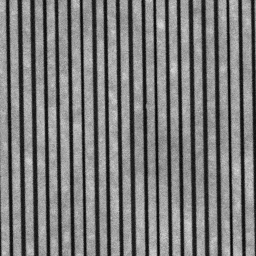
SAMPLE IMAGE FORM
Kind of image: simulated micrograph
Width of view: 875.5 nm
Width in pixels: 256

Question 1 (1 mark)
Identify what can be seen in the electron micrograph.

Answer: parallel lines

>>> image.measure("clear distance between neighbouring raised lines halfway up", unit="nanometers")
12.4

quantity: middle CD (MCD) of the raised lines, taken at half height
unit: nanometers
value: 27.8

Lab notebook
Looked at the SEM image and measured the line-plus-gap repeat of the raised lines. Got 41.9 nm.